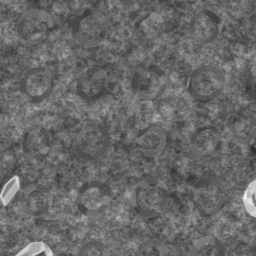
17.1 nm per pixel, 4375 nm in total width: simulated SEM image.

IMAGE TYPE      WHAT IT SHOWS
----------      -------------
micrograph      a regular array of ring-shaped raised bodies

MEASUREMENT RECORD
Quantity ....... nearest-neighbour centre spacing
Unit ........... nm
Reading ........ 959